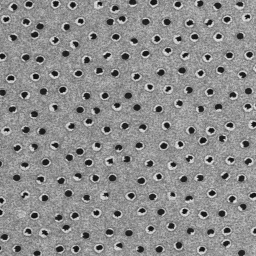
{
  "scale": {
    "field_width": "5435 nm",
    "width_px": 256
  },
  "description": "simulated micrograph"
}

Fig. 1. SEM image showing a regular array of holes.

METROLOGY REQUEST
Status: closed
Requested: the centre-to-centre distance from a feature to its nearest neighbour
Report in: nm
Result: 355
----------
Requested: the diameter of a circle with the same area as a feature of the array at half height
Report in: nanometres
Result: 138